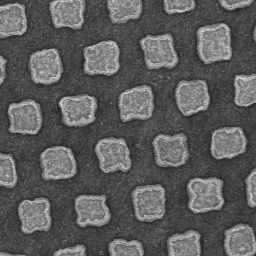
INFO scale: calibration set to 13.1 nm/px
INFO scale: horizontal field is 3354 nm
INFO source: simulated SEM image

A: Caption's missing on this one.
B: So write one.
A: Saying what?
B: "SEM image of a regular array of raised bodies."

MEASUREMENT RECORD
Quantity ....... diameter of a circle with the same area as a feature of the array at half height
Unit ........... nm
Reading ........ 438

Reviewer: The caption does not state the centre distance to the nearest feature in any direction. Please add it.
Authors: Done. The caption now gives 735 nanometers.